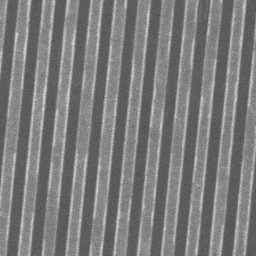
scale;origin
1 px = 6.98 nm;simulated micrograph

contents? parallel lines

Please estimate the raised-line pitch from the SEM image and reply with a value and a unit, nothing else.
166 nm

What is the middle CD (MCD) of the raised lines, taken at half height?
85 nm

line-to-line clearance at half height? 80.7 nm